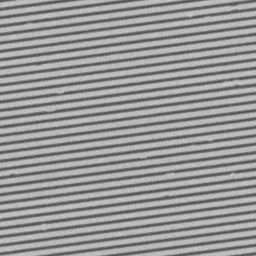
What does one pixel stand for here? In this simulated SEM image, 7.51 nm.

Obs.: parallel lines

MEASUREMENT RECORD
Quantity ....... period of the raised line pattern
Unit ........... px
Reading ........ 8.36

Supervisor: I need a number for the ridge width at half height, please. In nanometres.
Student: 39.1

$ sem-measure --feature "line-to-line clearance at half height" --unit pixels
3.48